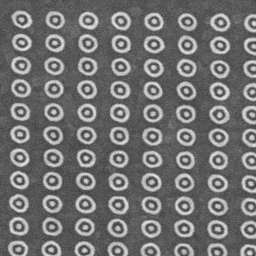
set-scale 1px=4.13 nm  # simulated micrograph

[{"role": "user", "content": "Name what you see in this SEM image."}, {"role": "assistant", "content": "a regular array of ring-shaped raised bodies with a dot in the middle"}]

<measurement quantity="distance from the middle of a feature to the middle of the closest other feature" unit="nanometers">95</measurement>